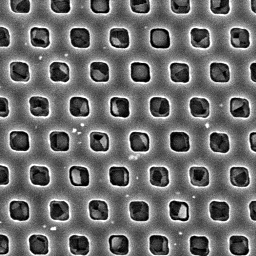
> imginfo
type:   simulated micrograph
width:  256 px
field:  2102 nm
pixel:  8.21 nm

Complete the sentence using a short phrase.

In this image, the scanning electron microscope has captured a regular array of holes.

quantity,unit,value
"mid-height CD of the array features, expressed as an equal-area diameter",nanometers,177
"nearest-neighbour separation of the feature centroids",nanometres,323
